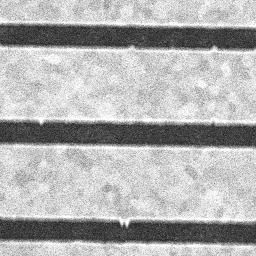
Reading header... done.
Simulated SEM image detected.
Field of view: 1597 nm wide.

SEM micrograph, one or a few lines or trenches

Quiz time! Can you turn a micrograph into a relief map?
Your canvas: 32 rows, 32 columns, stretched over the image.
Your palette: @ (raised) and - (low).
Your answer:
@@@@@@@@@@@@@@@@@@@@@@@@@@@@@@@@
@@@@@@@@@@@@@@@@@@@@@@@@@@@@@@@@
@@@@@@@@@@@@@@@@@@@@@@@@@@@@@@@@
--------------------------------
--------------------------------
--------------------------------
@@@@@@@@@@@@@@@@@@@@@@@@@@@@@@@@
@@@@@@@@@@@@@@@@@@@@@@@@@@@@@@@@
@@@@@@@@@@@@@@@@@@@@@@@@@@@@@@@@
@@@@@@@@@@@@@@@@@@@@@@@@@@@@@@@@
@@@@@@@@@@@@@@@@@@@@@@@@@@@@@@@@
@@@@@@@@@@@@@@@@@@@@@@@@@@@@@@@@
@@@@@@@@@@@@@@@@@@@@@@@@@@@@@@@@
@@@@@@@@@@@@@@@@@@@@@@@@@@@@@@@@
@@@@@@@@@@@@@@@@@@@@@@@@@@@@@@@@
--------------------------------
--------------------------------
--------------------------------
@@@@@@@@@@@@@@@@@@@@@@@@@@@@@@--
@@@@@@@@@@@@@@@@@@@@@@@@@@@@@@@@
@@@@@@@@@@@@@@@@@@@@@@@@@@@@@@@@
@@@@@@@@@@@@@@@@@@@@@@@@@@@@@@@@
@@@@@@@@@@@@@@@@@@@@@@@@@@@@@@@@
@@@@@@@@@@@@@@@@@@@@@@@@@@@@@@@@
@@@@@@@@@@@@@@@@@@@@@@@@@@@@@@@@
@@@@@@@@@@@@@@@@@@@@@@@@@@@@@@@@
@@@@@@@@@@@@@@@@@@@@@@@@@@@@@@@@
---------------@@@@@@@@@@@@@@@@@
--------------------------------
--------------------------------
@@@@@@@@@@@@@@@@@@@@-@-@@@------
@@@@@@@@@@@@@@@@@@@@@@@@@@@@@@@@